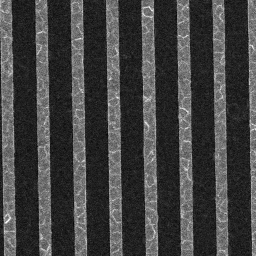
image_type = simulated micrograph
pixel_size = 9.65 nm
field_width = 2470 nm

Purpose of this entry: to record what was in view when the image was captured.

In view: parallel lines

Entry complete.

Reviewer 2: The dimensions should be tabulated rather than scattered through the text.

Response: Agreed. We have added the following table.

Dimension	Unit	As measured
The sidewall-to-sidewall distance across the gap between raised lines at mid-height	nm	228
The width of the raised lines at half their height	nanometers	112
